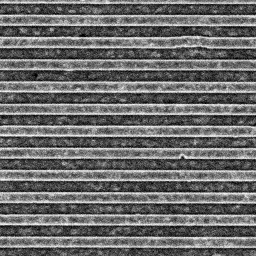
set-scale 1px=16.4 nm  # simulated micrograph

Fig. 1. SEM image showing parallel lines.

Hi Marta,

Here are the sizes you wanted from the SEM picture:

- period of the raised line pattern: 22.1 pixels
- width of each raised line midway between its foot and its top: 166 nm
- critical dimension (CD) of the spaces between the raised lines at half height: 193 nanometers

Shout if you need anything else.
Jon